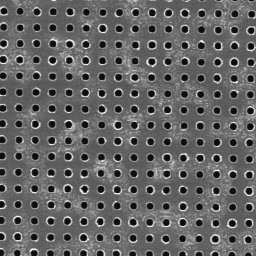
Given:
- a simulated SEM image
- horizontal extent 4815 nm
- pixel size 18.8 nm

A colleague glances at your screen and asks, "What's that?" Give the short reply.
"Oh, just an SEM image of a regular array of holes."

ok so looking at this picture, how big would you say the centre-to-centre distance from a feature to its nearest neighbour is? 300 nm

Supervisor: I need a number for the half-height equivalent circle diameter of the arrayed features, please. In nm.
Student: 134